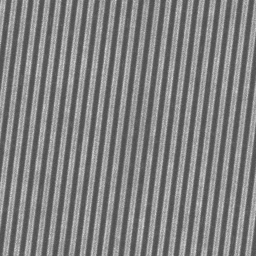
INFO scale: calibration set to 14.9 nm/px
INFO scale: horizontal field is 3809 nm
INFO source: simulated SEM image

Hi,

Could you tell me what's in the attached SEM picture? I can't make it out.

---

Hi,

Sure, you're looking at parallel lines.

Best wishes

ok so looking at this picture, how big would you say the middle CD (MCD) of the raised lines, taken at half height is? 86.7 nm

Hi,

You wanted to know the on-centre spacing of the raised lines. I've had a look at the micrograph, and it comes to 163 nm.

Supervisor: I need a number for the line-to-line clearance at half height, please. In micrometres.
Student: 0.0757